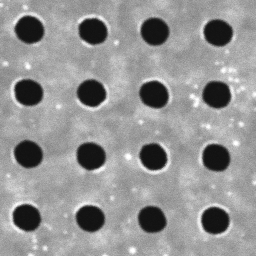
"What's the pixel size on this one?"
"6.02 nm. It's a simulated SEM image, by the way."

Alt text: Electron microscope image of a regular array of holes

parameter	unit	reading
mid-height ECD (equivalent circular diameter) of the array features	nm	174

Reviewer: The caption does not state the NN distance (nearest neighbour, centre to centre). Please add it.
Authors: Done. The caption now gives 374 nanometers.